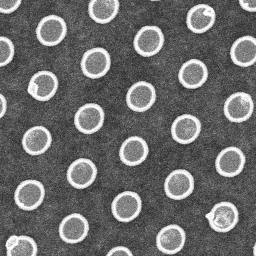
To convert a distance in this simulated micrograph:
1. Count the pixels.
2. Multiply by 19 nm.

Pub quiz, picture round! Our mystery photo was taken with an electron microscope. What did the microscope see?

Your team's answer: a regular array of raised bodies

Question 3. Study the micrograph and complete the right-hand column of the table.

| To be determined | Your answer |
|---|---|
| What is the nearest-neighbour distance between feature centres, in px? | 55.2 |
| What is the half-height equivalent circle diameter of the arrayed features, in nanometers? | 515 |